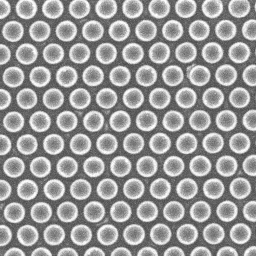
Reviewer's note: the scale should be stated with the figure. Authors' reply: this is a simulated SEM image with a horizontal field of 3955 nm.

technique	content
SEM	a regular array of raised bodies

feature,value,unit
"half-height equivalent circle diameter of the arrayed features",300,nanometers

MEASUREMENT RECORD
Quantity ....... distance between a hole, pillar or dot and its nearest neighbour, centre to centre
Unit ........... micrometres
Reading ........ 0.401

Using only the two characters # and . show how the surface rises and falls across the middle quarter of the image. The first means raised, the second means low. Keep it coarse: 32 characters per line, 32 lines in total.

................................
###..####...####...####..####...
###..#####..####..#####..#####..
###..#####..####..#####..#####..
###...###...####...####..####...
................................
...##.....##....###....##.....##
..####...####..####...####..####
..####..#####..#####..####..####
..####...####..####...####..####
...###...###....###...###....###
................................
##....###...####...###....###...
###..#####..####..#####..#####..
###..#####..####..#####..#####..
###..####...####...####..####...
#............##...........##....
................................
..####...####...###...####...###
..####..#####..#####..####..####
..####..#####..#####..####..####
..####...####...###...####...###
................................
##....##.....##.....##.....#....
###..####...####...####..####...
###..#####..####..#####..#####..
###..#####..####..#####..####...
##....###....##....###....###...
................................
...###...###....###...####...###
..####...####..#####..####..####
..#####.#####..#####..####..####